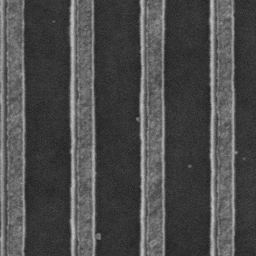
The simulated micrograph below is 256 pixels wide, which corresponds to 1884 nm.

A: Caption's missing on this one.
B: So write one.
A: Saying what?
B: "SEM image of lines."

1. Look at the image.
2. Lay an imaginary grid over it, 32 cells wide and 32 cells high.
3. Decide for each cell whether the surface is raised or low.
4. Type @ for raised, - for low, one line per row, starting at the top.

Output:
@@@------@@-------@@------@@@---
@@@------@@-------@@-------@@---
@@@------@@-------@@-------@@---
@@@------@@@------@@-------@@---
@@@------@@@------@@------@@@---
@@@------@@@------@@-------@@---
@@@------@@-------@@-------@@---
@@@------@@@------@@-------@@---
@@@------@@@------@@-------@@---
@@@------@@@------@@-------@@---
@@@------@@-------@@-------@@---
@@@------@@-------@@-------@@---
@@@------@@@------@@-------@@---
@@@------@@@------@@-------@@---
@@@------@@@------@@-------@@---
@@@------@@@------@@-------@@---
@@@------@@@------@@-------@@---
@@@------@@@------@@-------@@---
@@@------@@@------@@-------@@---
@@@------@@@------@@------@@@---
@@@------@@@------@@-------@@---
@@@------@@@------@@-------@@---
@@@------@@@------@@-------@@---
@@@------@@@------@@-------@@---
@@@------@@@------@@-------@@---
@@@------@@@------@@-------@@---
@@@------@@@------@@-------@@---
@@@------@@@------@@-------@@---
@@@------@@@------@@-------@@---
@@@------@@@------@@-------@@---
@@@------@@@------@@-------@@---
@@@------@@@------@@-------@@---